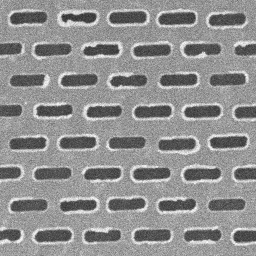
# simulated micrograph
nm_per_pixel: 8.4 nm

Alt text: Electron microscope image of a regular array of holes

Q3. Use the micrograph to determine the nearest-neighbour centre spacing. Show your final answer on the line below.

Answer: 328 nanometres